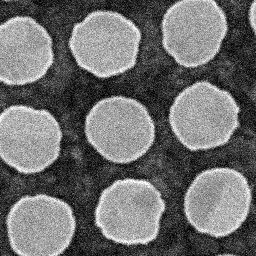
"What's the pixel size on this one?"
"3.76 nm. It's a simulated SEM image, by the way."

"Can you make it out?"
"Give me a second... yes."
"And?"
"raised bodies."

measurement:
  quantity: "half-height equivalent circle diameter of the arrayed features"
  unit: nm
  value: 248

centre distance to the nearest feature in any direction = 319 nm